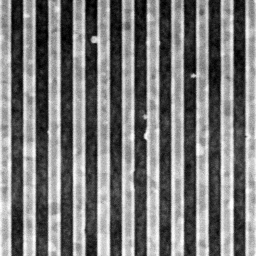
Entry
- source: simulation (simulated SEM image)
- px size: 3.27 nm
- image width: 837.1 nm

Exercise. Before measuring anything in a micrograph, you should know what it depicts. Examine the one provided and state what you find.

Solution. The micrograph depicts parallel lines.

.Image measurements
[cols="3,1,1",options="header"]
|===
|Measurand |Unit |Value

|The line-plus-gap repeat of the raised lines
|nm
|80.5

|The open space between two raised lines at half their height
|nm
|47.8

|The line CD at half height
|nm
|32.2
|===